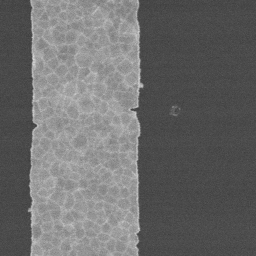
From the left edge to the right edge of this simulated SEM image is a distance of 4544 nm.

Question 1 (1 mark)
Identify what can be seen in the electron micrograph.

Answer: one or a few lines or trenches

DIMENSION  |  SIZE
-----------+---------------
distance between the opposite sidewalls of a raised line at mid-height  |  1870 nanometres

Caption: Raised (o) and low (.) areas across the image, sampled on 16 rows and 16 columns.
..ooooooo.......
..ooooooo.......
..oooooo........
..ooooooo.......
..ooooooo.......
..ooooooo.......
..oooooo........
..ooooooo.......
..ooooooo.......
..ooooooo.......
..ooooooo.......
..ooooooo.......
..ooooooo.......
..ooooooo.......
..ooooooo.......
..ooooooo.......